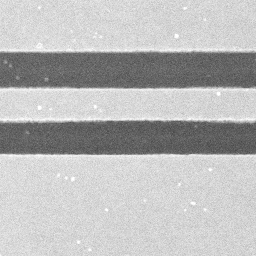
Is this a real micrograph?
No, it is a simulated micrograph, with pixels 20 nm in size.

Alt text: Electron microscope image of lines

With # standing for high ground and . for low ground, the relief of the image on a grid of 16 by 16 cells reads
################
################
################
................
................
................
################
########.#######
................
................
################
################
################
################
################
################